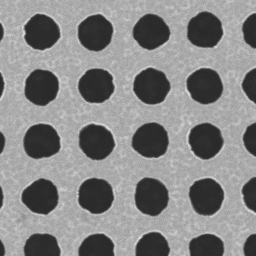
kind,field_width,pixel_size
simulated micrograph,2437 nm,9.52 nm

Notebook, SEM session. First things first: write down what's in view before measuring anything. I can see a regular array of holes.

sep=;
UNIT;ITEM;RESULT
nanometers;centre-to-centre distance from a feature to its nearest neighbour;514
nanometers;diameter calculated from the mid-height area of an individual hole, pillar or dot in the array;343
